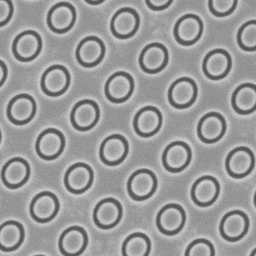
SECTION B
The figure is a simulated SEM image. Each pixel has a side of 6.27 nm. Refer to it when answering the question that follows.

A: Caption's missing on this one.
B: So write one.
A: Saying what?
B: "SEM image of a regular array of ring-shaped grooves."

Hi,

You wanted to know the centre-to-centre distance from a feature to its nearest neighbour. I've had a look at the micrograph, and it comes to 280 nm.